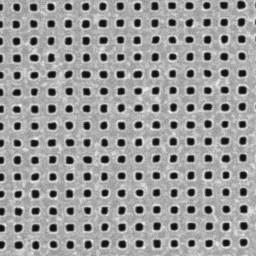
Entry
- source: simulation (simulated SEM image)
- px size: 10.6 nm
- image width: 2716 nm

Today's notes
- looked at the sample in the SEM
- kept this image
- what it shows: a regular array of holes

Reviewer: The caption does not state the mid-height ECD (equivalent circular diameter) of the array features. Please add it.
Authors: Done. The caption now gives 85.5 nm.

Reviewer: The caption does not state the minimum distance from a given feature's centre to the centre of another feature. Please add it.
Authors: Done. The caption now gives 177 nanometres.